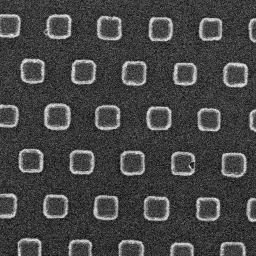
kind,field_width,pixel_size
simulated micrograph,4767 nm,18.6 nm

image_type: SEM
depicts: a regular array of raised bodies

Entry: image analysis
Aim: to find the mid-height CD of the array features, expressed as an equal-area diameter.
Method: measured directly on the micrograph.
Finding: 452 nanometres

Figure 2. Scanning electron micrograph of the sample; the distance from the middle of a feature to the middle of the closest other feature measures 937 nm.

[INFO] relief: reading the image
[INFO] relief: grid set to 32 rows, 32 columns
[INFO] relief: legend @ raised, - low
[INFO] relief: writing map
--------------------------------
--------------------------------
@@----@@@---@@@----@@-----@-----
@@----@@@---@@@----@@----@@@---@
@@----@@----@@@----@@----@@@---@
--------------------------------
--------------------------------
---@----------------------------
---@@----@@@---@@@----@@----@@@-
---@@----@@@---@@@----@@----@@@-
----------------@-----------@@--
--------------------------------
--------------------------------
@@----@@----@@@-----------------
@@----@@@---@@@----@@----@@----@
@@----@@@---@@@----@@----@@----@
--------------------------------
--------------------------------
--------------------------------
---@@----@@@---@@@----@@----@@--
---@@----@@@---@@@----@@----@@@-
---------@@----@@@----@@----@@@-
--------------------------------
--------------------------------
@@-----@------------------------
@@----@@----@@@---@@@----@@----@
@@----@@----@@@---@@@----@@----@
-------------------------------@
--------------------------------
--------------------------------
--@@@----@@----@@@----@-----@@--
--@@@----@@----@@@---@@@----@@@-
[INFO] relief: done